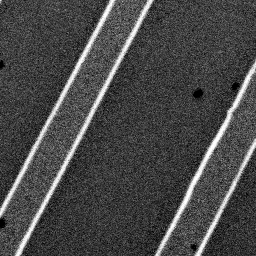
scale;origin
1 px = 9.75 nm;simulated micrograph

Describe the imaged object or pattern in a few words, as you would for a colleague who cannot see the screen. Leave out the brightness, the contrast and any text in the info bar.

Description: one or a few lines or trenches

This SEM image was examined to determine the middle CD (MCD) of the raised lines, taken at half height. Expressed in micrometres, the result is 0.345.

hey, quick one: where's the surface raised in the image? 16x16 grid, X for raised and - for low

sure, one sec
-------XX-------
------XXX-------
------XX--------
-----XXX--------
-----XX---------
----XXX--------X
----XX---------X
---XXX--------XX
---XX---------XX
--XX---------XXX
--XX---------XX-
-XX---------XXX-
XXX---------XX--
XX---------XXX--
XX---------XX---
X---------XXX---